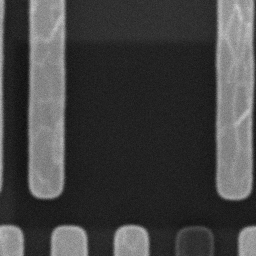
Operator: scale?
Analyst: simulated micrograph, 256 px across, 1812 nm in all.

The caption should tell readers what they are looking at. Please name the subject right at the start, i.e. wiring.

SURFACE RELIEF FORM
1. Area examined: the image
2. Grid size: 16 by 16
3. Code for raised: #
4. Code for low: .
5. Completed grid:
..##..........##
..##..........##
..##..........##
..##..........##
..##..........##
..##..........##
..##..........##
..##..........##
..##..........##
..##..........##
..##..........##
..##..........##
................
................
#..##..##..##..#
#..##..##..##..#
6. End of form